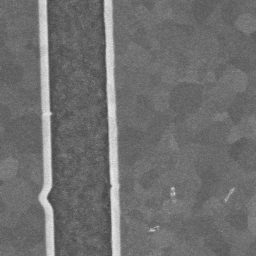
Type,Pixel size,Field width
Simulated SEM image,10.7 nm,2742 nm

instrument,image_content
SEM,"one or a few lines or trenches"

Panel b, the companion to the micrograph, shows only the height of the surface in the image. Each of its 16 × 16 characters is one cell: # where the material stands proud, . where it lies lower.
###....#########
###....#########
###....#########
###....#########
###....#########
###....#########
###....#########
###....#########
###....#########
###....#########
###....#########
###....#########
###....#########
###....#########
###....#########
###....#########